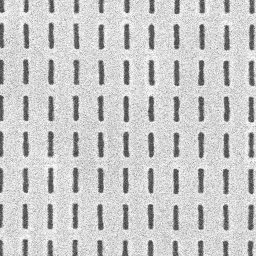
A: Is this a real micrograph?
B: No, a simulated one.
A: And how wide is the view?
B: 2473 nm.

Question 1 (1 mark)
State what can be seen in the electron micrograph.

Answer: a regular array of holes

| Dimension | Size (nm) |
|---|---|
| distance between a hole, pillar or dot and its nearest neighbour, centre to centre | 241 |